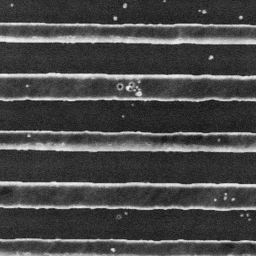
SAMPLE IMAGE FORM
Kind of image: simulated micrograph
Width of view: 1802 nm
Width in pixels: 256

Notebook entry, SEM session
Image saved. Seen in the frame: lines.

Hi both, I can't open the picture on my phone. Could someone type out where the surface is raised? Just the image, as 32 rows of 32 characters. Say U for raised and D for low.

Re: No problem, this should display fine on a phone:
DDDDDDDDDDDDDDDDDDDDDDDDDDDDDDDD
DDDDDDDDDDDDDDDDDDDDDDDDDDDDDDDD
DDDDDDDDDDDDDDDDDDDDDDDDDDDDDDDD
UUUUUUUUUUUUUUUUUUUUUUUUUUUUUUUU
UUUUUUUUUUUUUUUUUUUUUUUUUUUUUUUU
DDDDDDDDDDDDDDDDDDDDDDDDDDDDDDDD
DDDDDDDDDDDDDDDDDDDDDDDDDDDDDDDD
DDDDDDDDDDDDDDDDDDDDDDDDDDDDDDDD
DDDDDDDDDDDDDDDDDDDDDDDDDDDDDDDD
UUUUUUUUUUUUUUDDDDDDDDDDDDDDDDDD
UUUUUUUUUUUUUUUUUUUUUUUUUUUUUUUU
UUUUUUUUUUUUUUUUUUUUUUUUUUUUUUUU
UDDDDDDDUUDDDDDDDDDUUUDUUUDUUUUU
DDDDDDDDDDDDDDDDDDDDDDDDDDDDDDDD
DDDDDDDDDDDDDDDDDDDDDDDDDDDDDDDD
DDDDDDDDDDDDDDDDDDDDDDDDDDDDDDDD
UUUUUUUDDDUDDDDDDDDDDDDDDDDDDDDD
UUUUUUUUUUUUUUUUUUUUUUUUUUUUUUUU
DDDDDDDDUUUUUUDDDDUUUUUUUUUUUUUU
DDDDDDDDDDDDDDDDDDDDDDDDDDDDDDDD
DDDDDDDDDDDDDDDDDDDDDDDDDDDDDDDD
DDDDDDDDDDDDDDDDDDDDDDDDDDDDDDDD
DDDDDDDDDDDDDDDDDDDDDDDDDDDDDDDD
UUUUUUUUUUUUUUUUUUUUUUUUUUUUUUUU
UUUUUUUUUUUUUUUUUUUUUUUUUUUUUUUU
UUUUUUUUUUUUUUUUUUUUUUUUUUUUUUUU
DDDDDDDDDDDDDDDDDDDDDDDDDDDDDDDD
DDDDDDDDDDDDDDDDDDDDDDDDDDDDDDDD
DDDDDDDDDDDDDDDDDDDDDDDDDDDDDDDD
DDDDDDDDDDDDDDDDDDDDDDDDDDDDDDDD
UUUUUUUUUUUUUUUUUUUUUUUUUUUUUUUU
UUUUUUUUUUUUUUUUUUUUUUUUUUUUUUUU